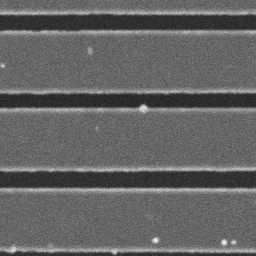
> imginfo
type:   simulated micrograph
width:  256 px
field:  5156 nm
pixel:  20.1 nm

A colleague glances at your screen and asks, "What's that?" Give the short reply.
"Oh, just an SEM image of lines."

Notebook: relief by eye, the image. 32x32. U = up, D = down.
UUUUUUUUUUUUUUUUUUUUUUUUUUUUUUUU
UUUUUUUUUUUUUUUUUUUUUUUUUUUUUUUU
DDDDDDDDDDDDDDDDDDDDDDDDDDDDDDDD
DDDDDDDDDDDDDDDDDDDDDDDDDDDDDDDD
UUUUUUUUUUUUUUUUUUUUUUUUUUUUUUUU
UUUUUUUUUUUUUUUUUUUUUUUUUUUUUUUU
UUUUUUUUUUUUUUUUUUUUUUUUUUUUUUUU
UUUUUUUUUUUUUUUUUUUUUUUUUUUUUUUU
UUUUUUUUUUUUUUUUUUUUUUUUUUUUUUUU
UUUUUUUUUUUUUUUUUUUUUUUUUUUUUUUU
UUUUUUUUUUUUUUUUUUUUUUUUUUUUUUUU
UUUUUUUUUUUUUUUUUUUUUUUUUUUUUUUU
DDDDDDDDDDDDDDDDDDDDDDDDDDDDDDDD
DDDDDDDDDDDDDDDDDUUDDDDDUDDDDDDD
UUUUUUUUUUUUUUUUUUUUUUUUUUUUUUUU
UUUUUUUUUUUUUUUUUUUUUUUUUUUUUUUU
UUUUUUUUUUUUUUUUUUUUUUUUUUUUUUUU
UUUUUUUUUUUUUUUUUUUUUUUUUUUUUUUU
UUUUUUUUUUUUUUUUUUUUUUUUUUUUUUUU
UUUUUUUUUUUUUUUUUUUUUUUUUUUUUUUU
UUUUUUUUUUUUUUUUUUUUUUUUUUUUUUUU
DDDDDDDDDDDDDDDDDDDDDDDDDDDDDDDD
DDDDDDDDDDDDDDDDDDDDDDDDDDDDDDDD
DDDDDDDDDDDDDDDDDDDDDDDDDDDDDDDD
UUUUUUUUUUUUUUUUUUUUUUUUUUUUUUUU
UUUUUUUUUUUUUUUUUUUUUUUUUUUUUUUU
UUUUUUUUUUUUUUUUUUUUUUUUUUUUUUUU
UUUUUUUUUUUUUUUUUUUUUUUUUUUUUUUU
UUUUUUUUUUUUUUUUUUUUUUUUUUUUUUUU
UUUUUUUUUUUUUUUUUUUUUUUUUUUUUUUU
UUUUUUUUUUUUUUUUUUUUUUUUUUUUUUUU
DUDDDDUDDDDDDDUUDDDDDUDUUUUUUUUU